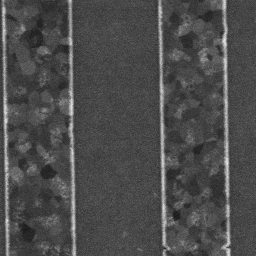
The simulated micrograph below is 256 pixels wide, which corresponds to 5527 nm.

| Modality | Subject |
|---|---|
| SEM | one or a few lines or trenches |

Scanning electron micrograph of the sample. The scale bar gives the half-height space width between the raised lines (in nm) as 1930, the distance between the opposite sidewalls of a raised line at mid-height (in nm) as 1410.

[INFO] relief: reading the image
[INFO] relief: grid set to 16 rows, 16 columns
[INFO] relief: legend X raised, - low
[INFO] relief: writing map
XXXX------XXXX--
XXXX------XXXX--
XXXX------XXXX--
XXXX------XXXX--
XXXX------XXXX--
XXXX------XXXX--
XXXX------XXXX--
XXXX------XXXX--
XXXX------XXXX--
XXXXX-----XXXX--
XXXXX-----XXXX--
XXXXX-----XXXX--
XXXXX-----XXXX--
XXXXX-----XXXX--
XXXXX-----XXXX--
-XXXX-----XXXX--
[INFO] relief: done